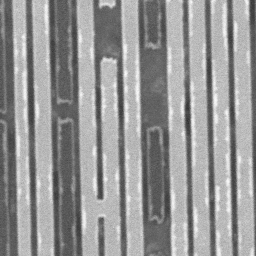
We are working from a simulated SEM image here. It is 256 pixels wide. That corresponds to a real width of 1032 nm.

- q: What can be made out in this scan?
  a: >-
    parallel lines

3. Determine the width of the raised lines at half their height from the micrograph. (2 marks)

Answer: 59.9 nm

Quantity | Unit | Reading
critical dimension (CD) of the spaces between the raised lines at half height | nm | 30.2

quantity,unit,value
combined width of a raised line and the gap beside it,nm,89.3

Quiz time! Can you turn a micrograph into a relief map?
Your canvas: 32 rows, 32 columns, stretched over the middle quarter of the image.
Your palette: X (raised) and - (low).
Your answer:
XX--XXX--XXXX--XXXX-------XXXX--
XX--XXX--XXXX--XXXX-------XXXX--
XX--XXX--XXXX--XXXX-------XXXX--
XX--XXX---XXX--XXXX-------XXXX--
XX--XXX---XXX--XXXX-------XXXX--
XX--XXX--XXXX--XXXX-------XXXX--
XX--XXX--XXXX--XXXX-------XXXX--
XX--XXXX--XXX--XXXX-------XXXX--
XX--XXXX--XXX--XXXX-------XXXX--
-X--XXXX--XXX--XXXX-------XXXX--
----XXXX--XXX--XXXX-------XXXX--
----XXXX-XXXX--XXXX-------XXXX--
----XXXX-XXXX--XXXX-------XXXX--
----XXXX--XXX--XXXX--------XXX--
XX--XXXX--XXX--XXXX--------XXX--
XX--XXXX--XXX--XXXX--------XXX--
XX--XXXX--XXX--XXXX--XXX---XXX--
XX--XXXX--XXX--XXXX--XXX---XXX--
XX--XXXX--XXX--XXXX--XXXX--XXX--
XX--XXXX--XXX--XXXX--XXXX--XXX--
XX--XXXX--XXX--XXXX--XXXX--XXX--
XX--XXXX--XXX---XXX--XXXX--XXX--
XX--XXXX--XXX---XXX--XXXX--XXX--
XX--XXXX--XXX---XXX--XXXX--XXX--
XX--XXXX--XXX---XXX--XXXX--XXX--
XX--XXXX--XXX---XXX--XXXX--XXX--
XX--XXXX--XXXX--XXX--XXXX--XXX--
XX--XXXX--XXXX--XXX--XXXX--XXX--
XX--XXXX--XXXX--XXX--XXXX--XXX--
XX---XXX--XXXX--XXX--XXXX--XXX--
XX---XXX--XXXX--XXX--XXXX--XXX--
XX---XXX--XXXX--XXX--XXXX--XXX--